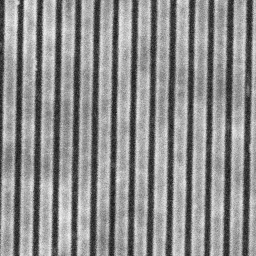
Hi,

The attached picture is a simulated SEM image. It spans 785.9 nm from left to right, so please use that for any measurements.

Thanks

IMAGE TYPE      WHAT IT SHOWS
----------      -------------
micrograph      parallel lines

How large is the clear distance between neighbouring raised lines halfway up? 8.01 pixels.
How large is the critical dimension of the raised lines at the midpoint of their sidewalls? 36.8 nm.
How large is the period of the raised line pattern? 0.0585 um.